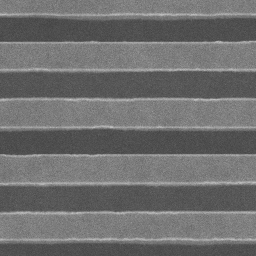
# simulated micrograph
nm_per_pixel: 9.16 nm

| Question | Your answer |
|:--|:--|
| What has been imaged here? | lines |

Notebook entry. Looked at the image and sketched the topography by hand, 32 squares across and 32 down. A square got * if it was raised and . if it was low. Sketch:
********************************
********************************
................................
................................
................................
********************************
********************************
********************************
********************************
................................
................................
................................
********************************
********************************
********************************
********************************
................................
................................
................................
********************************
********************************
********************************
********************************
................................
................................
................................
..............................*.
********************************
********************************
********************************
................................
................................